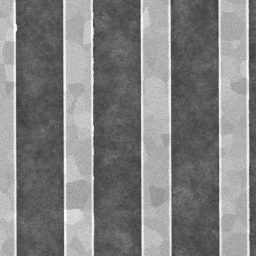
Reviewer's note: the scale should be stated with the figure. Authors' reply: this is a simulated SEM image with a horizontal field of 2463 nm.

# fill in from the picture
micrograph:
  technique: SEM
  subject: one or a few lines or trenches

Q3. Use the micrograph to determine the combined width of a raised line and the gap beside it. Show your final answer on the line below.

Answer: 0.747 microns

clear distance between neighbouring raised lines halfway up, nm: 477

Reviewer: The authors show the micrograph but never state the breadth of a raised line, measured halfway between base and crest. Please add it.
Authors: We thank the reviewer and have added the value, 273 nm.